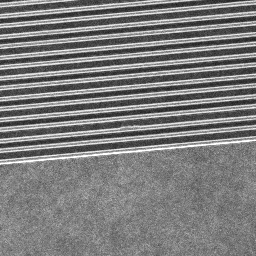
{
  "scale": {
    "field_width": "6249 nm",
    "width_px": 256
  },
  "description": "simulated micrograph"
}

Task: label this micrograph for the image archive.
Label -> parallel lines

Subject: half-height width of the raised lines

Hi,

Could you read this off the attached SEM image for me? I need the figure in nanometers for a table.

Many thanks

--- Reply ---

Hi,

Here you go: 94.2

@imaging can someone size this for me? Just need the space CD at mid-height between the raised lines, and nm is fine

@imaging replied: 163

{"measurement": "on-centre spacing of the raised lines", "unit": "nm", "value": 253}